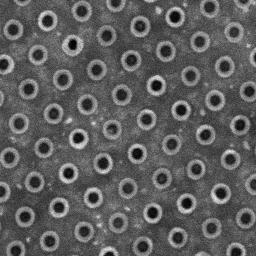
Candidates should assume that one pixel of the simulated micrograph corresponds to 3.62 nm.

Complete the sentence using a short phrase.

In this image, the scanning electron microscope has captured a regular array of ring-shaped raised bodies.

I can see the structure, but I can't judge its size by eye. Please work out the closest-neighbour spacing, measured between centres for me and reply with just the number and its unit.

126 nm